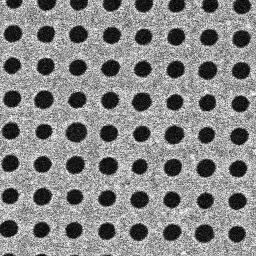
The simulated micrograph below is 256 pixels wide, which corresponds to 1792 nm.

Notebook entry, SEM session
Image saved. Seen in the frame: a regular array of holes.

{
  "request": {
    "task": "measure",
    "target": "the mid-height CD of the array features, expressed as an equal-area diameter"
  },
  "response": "123 nm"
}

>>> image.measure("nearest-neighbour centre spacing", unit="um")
0.225